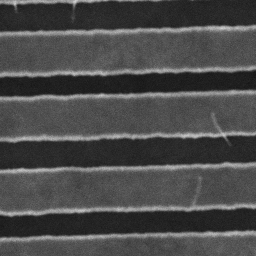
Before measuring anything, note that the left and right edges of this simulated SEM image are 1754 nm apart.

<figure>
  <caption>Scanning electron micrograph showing lines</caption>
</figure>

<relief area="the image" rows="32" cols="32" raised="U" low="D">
UUUDDDDDDDDDDDDDDDDDDDDDDDDDDDDD
DDDDDDDDDDDDDDDDDDDDDDDDDDDDDDDD
DDDDDDDDDDDDDDDDDDDDDDDDDDDDDDDD
DDDDDDDDDDDDDDDDDDDDUDUUUUUUUUUU
UUUUUUUUUUUUUUUUUUUUUUUUUUUUUUUU
UUUUUUUUUUUUUUUUUUUUUUUUUUUUUUUU
UUUUUUUUUUUUUUUUUUUUUUUUUUUUUUUU
UUUUUUUUUUUUUUUUUUUUUUUUUUUUUUUU
UUUUUUUUUUUUUUUUUUUUUUUUUUUUUUUU
UUUUUUDDDDDDDDDDDDDDDDDDDDDDDDDD
DDDDDDDDDDDDDDDDDDDDDDDDDDDDDDDD
DDDDDDDDDDDDDDDDDDDDDDUUUUUUUUUU
UUUUUUUUUUUUUUUUUUUUUUUUUUUUUUUU
UUUUUUUUUUUUUUUUUUUUUUUUUUUUUUUU
UUUUUUUUUUUUUUUUUUUUUUUUUUUUUUUU
UUUUUUUUUUUUUUUUUUUUUUUUUUUUUUUU
UUUUUUUUUUUUUUUUUUUUUUUUUUUUUUUU
UUUUUUUUUUUDDDDDDDDDDDDDDDDDDDDD
DDDDDDDDDDDDDDDDDDDDDDDDDDDDDDDD
DDDDDDDDDDDDDDDDDDDDDDDDDDDDDDDD
DDDDDDDDDDDDDDDDDDDDDDDDDDDUUUUU
UUUUUUUUUUUUUUUUUUUUUUUUUUUUUUUU
UUUUUUUUUUUUUUUUUUUUUUUUUUUUUUUU
UUUUUUUUUUUUUUUUUUUUUUUUUUUUUUUU
UUUUUUUUUUUUUUUUUUUUUUUUUUUUUUUU
UUUUUUUUUUUUUUUUUUUUUUUUUUUUUUUU
UUUUUUUUUUUUDDDUDDDDDDDDDDDDDDDD
DDDDDDDDDDDDDDDDDDDDDDDDDDDDDDDD
DDDDDDDDDDDDDDDDDDDDDDDDDDDDDDDD
DDDDDUUDUUUUUUUUUUUUUUUUUUUUUUUU
UUUUUUUUUUUUUUUUUUUUUUUUUUUUUUUU
UUUUUUUUUUUUUUUUUUUUUUUUUUUUUUUU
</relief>